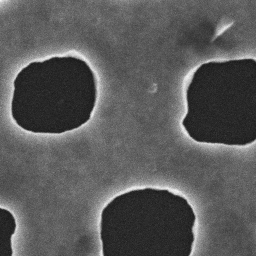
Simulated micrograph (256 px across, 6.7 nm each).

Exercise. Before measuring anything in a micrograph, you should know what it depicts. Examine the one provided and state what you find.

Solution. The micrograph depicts holes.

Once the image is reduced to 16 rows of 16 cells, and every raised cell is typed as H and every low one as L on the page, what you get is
HHHHHHHHHHHHHHHH
HHHHHHHHHHHHHHHH
HHHHHHHHHHHHHHHH
HHHHHHHHHHHHHHHH
HLLLLLHHHHHHLLLL
HLLLLLHHHHHHLLLL
HLLLLLHHHHHHLLLL
HLLLLHHHHHHHLLLL
HHHHHHHHHHHHLLLL
HHHHHHHHHHHHHHHH
HHHHHHHHHHHHHHHH
HHHHHHHHHHHHHHHH
HHHHHHHLLLLLHHHH
LHHHHHLLLLLLHHHH
LHHHHHLLLLLLHHHH
LHHHHHLLLLLLHHHH